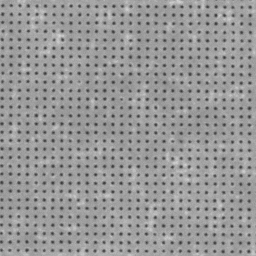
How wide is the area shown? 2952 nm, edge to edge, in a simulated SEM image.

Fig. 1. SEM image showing a regular array of holes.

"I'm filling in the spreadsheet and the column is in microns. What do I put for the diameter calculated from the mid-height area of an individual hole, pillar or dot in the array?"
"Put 0.039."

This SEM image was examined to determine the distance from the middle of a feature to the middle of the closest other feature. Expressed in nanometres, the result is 94.7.